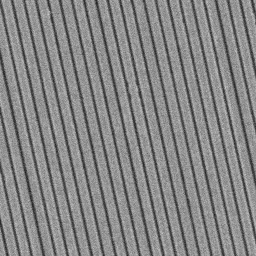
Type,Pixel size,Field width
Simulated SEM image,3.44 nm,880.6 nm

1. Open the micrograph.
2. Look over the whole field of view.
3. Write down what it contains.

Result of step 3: parallel lines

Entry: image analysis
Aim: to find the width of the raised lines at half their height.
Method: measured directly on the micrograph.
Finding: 0.0294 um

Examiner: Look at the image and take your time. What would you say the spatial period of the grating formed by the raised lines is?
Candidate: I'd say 40.3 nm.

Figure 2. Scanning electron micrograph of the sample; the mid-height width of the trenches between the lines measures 11.8 nm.